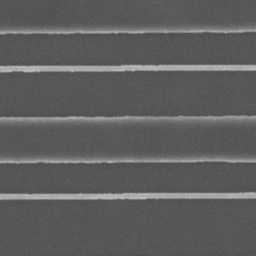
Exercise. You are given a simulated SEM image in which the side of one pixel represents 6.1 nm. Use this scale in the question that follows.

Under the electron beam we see lines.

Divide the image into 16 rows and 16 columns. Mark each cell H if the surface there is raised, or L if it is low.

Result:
HHHHHHHHHHHHHHHH
HHHHHHHHHHHHHHHH
LLLLLLLLLLLLLLLL
LLLLLLLLLLLLLLLL
LLLLLLLLLLLLLLLL
LLLLLLLLLLLLLLLL
LLLLLLLLLLLLLLLL
HHHHHHHHHHHHHHHH
HHHHHHHHHHHHHHHH
HHHHHHHHHHHHHHHH
LLLLLLLLLLLLLLLL
LLLLLLLLLLLLLLLL
LLLLLLLLLLLLLLLL
LLLLLLLLLLLLLLLL
LLLLLLLLLLLLLLLL
LLLLLLLLLLLLLLLL